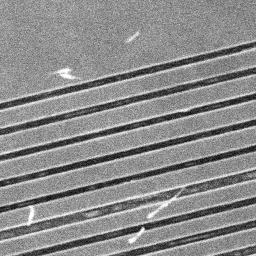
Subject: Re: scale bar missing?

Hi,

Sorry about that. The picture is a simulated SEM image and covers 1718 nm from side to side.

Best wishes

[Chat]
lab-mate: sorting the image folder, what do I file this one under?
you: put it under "parallel lines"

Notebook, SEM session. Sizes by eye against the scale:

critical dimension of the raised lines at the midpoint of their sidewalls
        117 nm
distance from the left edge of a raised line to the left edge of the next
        168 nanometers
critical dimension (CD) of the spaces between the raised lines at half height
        0.0472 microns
